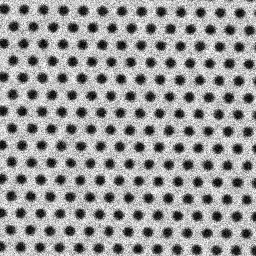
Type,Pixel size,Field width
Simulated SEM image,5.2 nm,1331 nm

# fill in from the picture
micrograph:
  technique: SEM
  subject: a regular array of holes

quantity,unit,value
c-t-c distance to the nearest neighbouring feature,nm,100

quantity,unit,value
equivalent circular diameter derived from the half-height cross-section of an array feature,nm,55.5